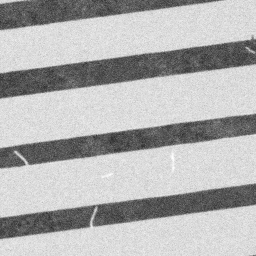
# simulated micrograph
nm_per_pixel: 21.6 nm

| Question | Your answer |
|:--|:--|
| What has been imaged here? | one or a few lines or trenches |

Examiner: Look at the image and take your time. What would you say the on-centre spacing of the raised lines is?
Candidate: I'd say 1520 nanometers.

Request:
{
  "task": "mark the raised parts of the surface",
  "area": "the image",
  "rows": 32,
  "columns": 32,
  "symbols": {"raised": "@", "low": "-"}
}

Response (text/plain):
-------------------------@@@@@@@
-----------------@@@@@@@@@@@@@@@
----------@@@@@@@@@@@@@@@@@@@@@@
---@@@@@@@@@@@@@@@@@@@@@@@@@@@@@
@@@@@@@@@@@@@@@@@@@@@@@@@@@@@@@@
@@@@@@@@@@@@@@@@@@@@@@@@@@@-----
@@@@@@@@@@@@@@@@@@@@------------
@@@@@@@@@@@@--------------------
@@@@-------------------------@@@
---------------------@@@@@@@@@@@
--------------@@@@@@@@@@@@@@@@@@
------@@@@@@@@@@@@@@@@@@@@@@@@@@
@@@@@@@@@@@@@@@@@@@@@@@@@@@@@@@@
@@@@@@@@@@@@@@@@@@@@@@@@@@@@@@@@
@@@@@@@@@@@@@@@@@@@@@@@@@@@@@---
@@@@@@@@@@@@@@@@@@@@@-----------
@@@@@@@@@@@@@@------------------
@@@@@@---------------------@@@@@
--------------------@@@@@@@@@@@@
------------@@@@@@@@@@@@@@@@@@@@
-----@@@@@@@@@@@@@@@@@@@@@@@@@@@
@@@@@@@@@@@@@@@@@@@@@@@@@@@@@@@@
@@@@@@@@@@@@@@@@@@@@@@@@@@@@@@@@
@@@@@@@@@@@@@@@@@@@@@@@@@@@@----
@@@@@@@@@@@@@@@@@@@@------------
@@@@@@@@@@@@@-------------------
@@@@@---------------------@@@@@@
------------------@@@@@@@@@@@@@@
-----------@@@@@@@@@@@@@@@@@@@@@
---@@@@@@@@@@@@@@@@@@@@@@@@@@@@@
@@@@@@@@@@@@@@@@@@@@@@@@@@@@@@@@
@@@@@@@@@@@@@@@@@@@@@@@@@@@@@@@@